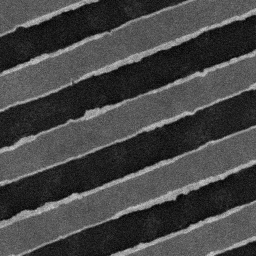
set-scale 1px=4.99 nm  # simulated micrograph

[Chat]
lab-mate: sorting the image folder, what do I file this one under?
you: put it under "one or a few lines or trenches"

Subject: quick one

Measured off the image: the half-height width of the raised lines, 179 nm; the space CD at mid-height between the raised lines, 170 nanometers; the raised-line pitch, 352 nanometres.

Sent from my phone